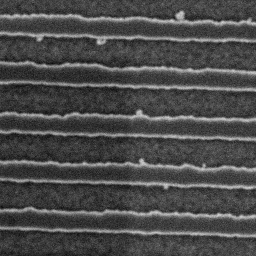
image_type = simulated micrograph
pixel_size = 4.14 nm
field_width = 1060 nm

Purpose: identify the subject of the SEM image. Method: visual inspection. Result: lines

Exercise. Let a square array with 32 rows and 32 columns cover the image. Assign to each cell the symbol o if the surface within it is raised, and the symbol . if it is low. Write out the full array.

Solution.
................................
................................
oooooooooooooooooooo..o.........
oooooooooooooooooooooooooooooooo
....o..ooooooooooooooooooooooooo
................................
................................
................................
oooooooooooooo..oooooo..........
oooooooooooooooooooooooooooooooo
......oooooooooooooooooooooooooo
................................
................................
................................
ooooooo.oooooooo.o..............
oooooooooooooooooooooooooooooooo
oooooooooooooooooooooooooooooooo
................................
................................
................................
ooooooooo.o.ooooo...............
oooooooooooooooooooooooooooooooo
oooooooooooooooooooooooooooooooo
............................o.oo
................................
................................
oooooooo..o..oooo..o............
oooooooooooooooooooooooooooooooo
oooooooooooooooooooooooooooooooo
............................oooo
................................
................................